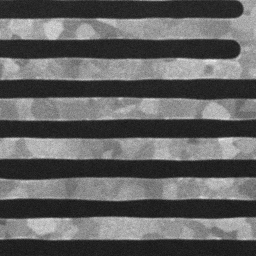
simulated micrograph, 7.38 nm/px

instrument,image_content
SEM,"groups of lines, slits or small figures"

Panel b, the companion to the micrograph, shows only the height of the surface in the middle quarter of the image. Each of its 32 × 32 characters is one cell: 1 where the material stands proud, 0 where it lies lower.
11111111111111111111111111111111
11111111111111111111111111111111
11111111111111111111111111111111
11111111111111111111111111111111
00000000000000000000000000000000
00000000000000000000000000000000
00000000000000000000000000000000
00000000000000000000000000000000
00000000000000000000000000000000
11111111111111111111111111111111
11111111111111111111111111111111
11111111111111111111111111111111
11111111111111111111111111111111
11111111111101100011111111110000
00000000000000000000000000000000
00000000000000000000000000000000
00000000000000000000000000000000
00000000000000000000000000000000
00000000000000000000000000000000
11111111111111111111111111111111
11111111111111111111111111111111
11111111111111111111111111111111
11111111111111111111111111111111
00111111001111111111111111111111
00000000000000000000000000000000
00000000000000000000000000000000
00000000000000000000000000000000
00000000000000000000000000000000
00000000000000000000000000000000
11111111111111111111111111111111
11111111111111111111111111111111
11111111111111111111111111111111